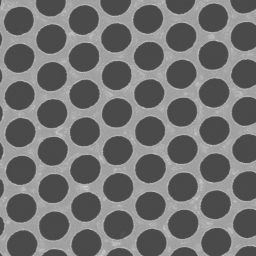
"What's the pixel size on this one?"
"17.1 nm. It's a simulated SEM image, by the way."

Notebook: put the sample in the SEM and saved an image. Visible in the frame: a regular array of holes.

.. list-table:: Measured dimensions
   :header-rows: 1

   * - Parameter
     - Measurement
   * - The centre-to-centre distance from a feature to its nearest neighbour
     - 0.634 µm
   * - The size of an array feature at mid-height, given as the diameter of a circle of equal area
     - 0.509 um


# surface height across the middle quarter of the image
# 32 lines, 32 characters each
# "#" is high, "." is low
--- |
##......##......##......##......
.##....###.......###..####......
.########........########.......
.########........#########......
.##....###.......##.....##......
##......##......##.......##....#
##.......###..####.......#######
#........#########.......#######
#........####.####.......####..#
##......###.....##......###.....
###....###.......##....###......
.########........#########......
.########........#########......
.###..####.......###...###......
###.....##......###......##.....
##.......##....###.......###...#
#........#########.......#######
#........#########.......#######
##.......###...###.......###....
##......###......##.....###.....
.###..####.......####.####......
.#########.......#########......
.#########.......####.####......
###.....##......###.....##......
##.......##.....##.......##....#
##.......#########.......#######
##.......#########........######
##.......###...###.......###....
##......###.....###.....###.....
.##....###.......###...###......
.#########.......#########......
.#########.......#########......